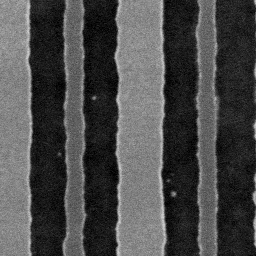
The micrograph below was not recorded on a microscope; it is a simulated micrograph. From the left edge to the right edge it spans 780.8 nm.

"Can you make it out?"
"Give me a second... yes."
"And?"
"lines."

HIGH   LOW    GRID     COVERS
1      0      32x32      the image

11110000110000011111000001100000
11110000110000011111000001100000
11110000110000011111000001100000
11110000110000011111000001100000
11110000110000011111000001100000
11110000110000011111000001100000
11110000110000111111000001100000
11110000110000111111000001100000
11110000110000011111000001100000
11110000110000011111000001100000
11110000110000011111000001100000
11110000110000011111000001100000
11110000110000011111000001100000
11110000110000011111000001100000
11110000110000011111000001100000
11110000111000011111000001100000
11110000111000011111000001100000
11110000111000011111000001100000
11110000111000011111000001100000
11110000110000011111000001100000
11110000110000011111000001100000
11110000110000011111000001100000
11110000110000011111000001100000
11110000110000011111000001100000
11110000110000011111000001100000
11110000110000011111000001100000
11110000111000011111000001100000
11110000111000011111100001100000
11110000110000011111100001100000
11110000110000011111100001100000
11110000110000011111100001100000
11110000110000011111000001100000